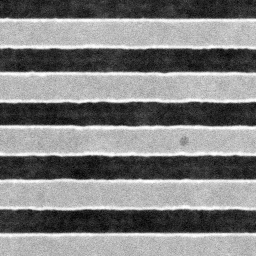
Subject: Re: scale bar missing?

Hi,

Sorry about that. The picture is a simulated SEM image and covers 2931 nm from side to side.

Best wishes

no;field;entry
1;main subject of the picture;lines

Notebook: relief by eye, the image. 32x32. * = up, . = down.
................................
................................
********************************
********************************
********************************
********************************
................................
................................
................................
********************************
********************************
********************************
********************************
................................
................................
................................
********************************
********************************
********************************
.......*.....**...*.............
................................
................................
.**...****.*...*.*....**........
********************************
********************************
********************************
................................
................................
................................
********************************
********************************
********************************